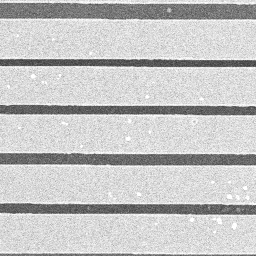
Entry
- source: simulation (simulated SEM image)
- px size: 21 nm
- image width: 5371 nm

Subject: lines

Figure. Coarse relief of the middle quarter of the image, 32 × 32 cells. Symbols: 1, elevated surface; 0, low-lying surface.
00000000000000000000000000000000
11111111111111111111111111111111
11111111111111111111111111111111
11111111111111111111111111111111
11111111111111111111111111111111
11111111111111111111111111111111
11111111111111111111111111111111
11111111111111111111111111111111
11111111111111111111111111111111
11111111111111111111111111111111
00000000000000000000000000000000
00000000000000000000000000000000
00000000000000000000000000000000
11111111111111111111111111111111
11111111111111111111111111111111
11111111111111111111111111111111
11111111111111111111111111111111
11111111111111111111111111111111
11111111111111111111111111111111
11111111111111111111111111111111
11111111111111111111111111111111
11111111111111111111111111111111
00000000000000000000000000000000
00000000000000000000000000000000
00000000000000000000000000000000
11111111101100000000000000000000
11111111111111111111111111111111
11111111111111111111111111111111
11111111111111111111111111111111
11111111111111111111111111111111
11111111111111111111111111111111
11111111111111111111111111111111